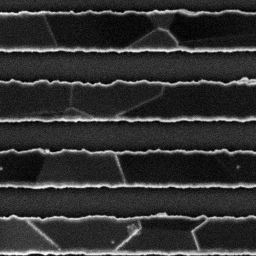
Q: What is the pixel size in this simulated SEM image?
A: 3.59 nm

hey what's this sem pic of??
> lines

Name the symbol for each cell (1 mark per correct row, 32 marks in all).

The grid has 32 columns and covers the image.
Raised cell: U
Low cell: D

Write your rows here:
DDDDDDDDDDDDDDDDDDDDDDDDDDDDDDDD
DDDDDUDDDDUUDUDDUDDUUUUDDDDDUUDD
UUUUUUUUUUUUUUUUUUUUUUUUUUUUUUUU
UUUUUUUUUUUUUUUUUUUUUUUUUUUUUUUU
UUUUUUUUUUUUUUUUUUUUUUUUUUUUUUUU
UUUUUUUUUUUUUUUUUUUUUUUUUUUUUUUU
DDDDDDDDDDDDDDDDDDDDDDDDDDDDDDDD
DDDDDDDDDDDDDDDDDDDDDDDDDDDDDDDD
DDDDDDDDDDDDDDDDDDDDDDDDDDDDDDDD
DDDDDDDDDDDDDDDDDDDDDDDDDDDDDDDD
UUUUUUUUUUUDUDUUUUUUUUUUUUUUUUUU
UUUUUUUUUUUUUUUUUUUUUUUUUUUUUUUU
UUUUUUUUUUUUUUUUUUUUUUUUUUUUUUUU
UUUUUUUUUUUUUUUUUUUUUUUUUUUUUUUU
UUUUUUUUUUUUUUUUUUUUUUUUUUUUUUUU
DDDDDDDDDDDDDDDDDDDDDDDDDDDDDDDD
DDDDDDDDDDDDDDDDDDDDDDDDDDDDDDDD
DDDDDDDDDDDDDDDDDDDDDDDDDDDDDDDD
DDDDDDDDDDDDDDDDDDDDDDDDDDDDDDDD
UUUUUUUUUUUUUUUUUUUUUUUUUUUUUUUU
UUUUUUUUUUUUUUUUUUUUUUUUUUUUUUUU
UUUUUUUUUUUUUUUUUUUUUUUUUUUUUUUU
UUUUUUUUUUUUUUUUUUUUUUUUUUUUUUUU
DDDDUDDDDDDDDDDDDDDDDDDDDDDDDDDD
DDDDDDDDDDDDDDDDDDDDDDDDDDDDDDDD
DDDDDDDDDDDDDDDDDDDDDDDDDDDDDDDD
DDDDDDDDDDDDDDDDDDDDDDDDDDDDDDDD
UUUUUUUUUUUUUUUUUUUUUUUUUUUUUUUU
UUUUUUUUUUUUUUUUUUUUUUUUUUUUUUUU
UUUUUUUUUUUUUUUUUUUUUUUUUUUUUUUU
UUUUUUUUUUUUUUUUUUUUUUUUUUUUUUUU
UUUUUUUUUUUUUUUUUUUUUUUUUUUUUUUU